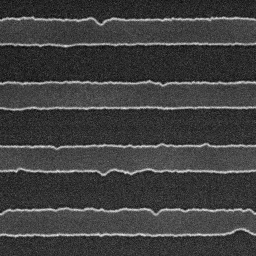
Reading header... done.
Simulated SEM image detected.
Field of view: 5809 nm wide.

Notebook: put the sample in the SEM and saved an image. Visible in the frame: parallel lines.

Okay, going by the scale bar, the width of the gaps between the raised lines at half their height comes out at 865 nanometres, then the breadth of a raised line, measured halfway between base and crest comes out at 584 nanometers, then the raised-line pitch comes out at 1440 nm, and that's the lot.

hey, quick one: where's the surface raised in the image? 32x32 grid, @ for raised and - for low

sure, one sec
--------------------------------
--------------------------------
@@@@@@@@@-@@--@@@@@@@@@@@@@@@@@@
@@@@@@@@@@@@@@@@@@@@@@@@@@@@@@@@
@@@@@@@@@@@@@@@@@@@@@@@@@@@@@@@@
@@@@@@@@@@@@@@@@@@@-@@@---@--@@-
--------------------------------
--------------------------------
--------------------------------
--------------------------------
@@@@@@@@@@@@@@@@@@@@-@@@@@@@@@@@
@@@@@@@@@@@@@@@@@@@@@@@@@@@@@@@@
@@@@@@@@@@@@@@@@@@@@@@@@@@@@@@@@
@@@@@@@@@@@-@--@----@@@-@-----@-
--------------------------------
--------------------------------
--------------------------------
--------------------------------
@@@@@@@@@@@@@@@@@@@@@@@@@@@@@@@@
@@@@@@@@@@@@@@@@@@@@@@@@@@@@@@@@
@@@@@@@@@@@@@@@@@@@@@@@@@@@@@@@@
------------@@--@----------@@---
--------------------------------
--------------------------------
--------------------------------
--------------------------------
-@@@@@@@@@@@@@@@@@@-@@@@@@@@@@@@
@@@@@@@@@@@@@@@@@@@@@@@@@@@@@@@@
@@@@@@@@@@@@@@@@@@@@@@@@@@@@@@@@
-@------------------------------
--------------------------------
--------------------------------